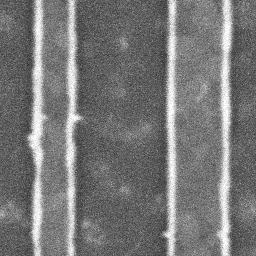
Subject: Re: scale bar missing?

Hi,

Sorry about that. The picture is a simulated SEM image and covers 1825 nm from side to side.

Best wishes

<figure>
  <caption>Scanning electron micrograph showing one or a few lines or trenches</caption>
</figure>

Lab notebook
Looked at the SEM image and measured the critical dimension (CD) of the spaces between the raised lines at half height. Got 714 nanometres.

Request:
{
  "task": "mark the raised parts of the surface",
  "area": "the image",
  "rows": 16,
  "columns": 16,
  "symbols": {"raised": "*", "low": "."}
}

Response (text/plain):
..**.......***..
..**.......***..
..**.......***..
..**.......***..
..**.......***..
..***......***..
..***......***..
..***......***..
..**.......***..
..**.......***..
..**.......***..
..**.......***..
..**.......***..
..***......***..
..***......***..
..**.......***..